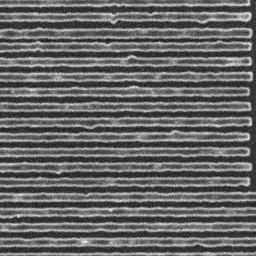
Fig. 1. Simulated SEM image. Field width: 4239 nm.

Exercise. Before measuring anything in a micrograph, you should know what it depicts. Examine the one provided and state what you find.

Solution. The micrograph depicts parallel lines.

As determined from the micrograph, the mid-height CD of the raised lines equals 7.37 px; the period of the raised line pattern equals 249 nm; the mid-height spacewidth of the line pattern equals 122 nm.